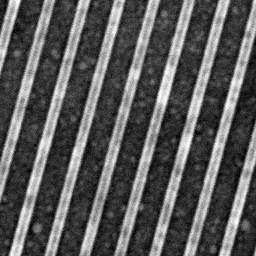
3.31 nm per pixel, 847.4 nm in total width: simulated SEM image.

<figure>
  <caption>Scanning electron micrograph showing parallel lines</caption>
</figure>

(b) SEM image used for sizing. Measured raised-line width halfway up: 28.3 nanometers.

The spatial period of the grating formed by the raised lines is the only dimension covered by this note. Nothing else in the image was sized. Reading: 0.111 microns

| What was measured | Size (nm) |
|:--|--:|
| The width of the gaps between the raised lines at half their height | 82.6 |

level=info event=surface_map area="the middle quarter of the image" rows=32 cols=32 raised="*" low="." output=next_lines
**......**.......**.......**....
*.......**.......**.......**....
*.......**.......**......**.....
*.......**......**.......**.....
*......**.......**.......**.....
.......**.......**......***.....
.......**......***......**......
.......*.......**.......**......
......**.......**.......**......
......**.......**......***......
......**......**.......**.......
.....**.......**.......**......*
.....**.......**.......**......*
.....**.......**......**.......*
.....**......**.......**.......*
....**.......**.......**......**
....**.......**......***......**
....**......**.......**.......**
....*.......**.......**.......**
...**.......**.......**......**.
...**.......**......***......**.
...**......**.......**.......**.
..**.......**.......**......***.
..**.......**.......**......**..
..**.......**......**.......**..
..**......**.......**.......**..
.**.......**.......**......***..
.**.......**......***......**...
.**......**.......**.......**...
.*.......**.......**.......**...
**.......**.......**......**....
**.......**......***......**....